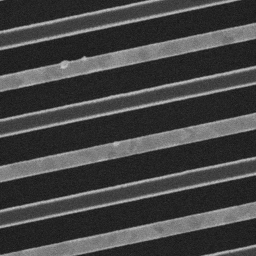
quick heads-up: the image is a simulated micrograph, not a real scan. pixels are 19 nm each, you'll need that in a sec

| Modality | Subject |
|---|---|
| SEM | lines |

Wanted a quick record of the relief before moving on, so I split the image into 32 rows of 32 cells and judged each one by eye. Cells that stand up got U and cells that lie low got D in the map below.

DDDDDDDDDDDDDDDDDUUUUUUUUUUUDDDD
DDDDDDDDDDDDUUUUUUUUUUUDDDDDDDDD
DDDDDDDUUUUUUUUUUUDDDDDDDDDDDDDD
DDUUUUUUUUUUUDDDDDDDDDDDDDDDDUUU
UUUUUUUUDDDDDDDDDDDDDDDDUUUUUUUU
UUUUDDDDDDDDDDDDDDDUUUUUUUUUUDDD
DDDDDDDDDDDDDDDUUUUUUUUUDDDDDDDD
DDDDDDDDDDUUUUUUUUUDDDDDDDDDDDDD
DDDDDUUUUUUUUUDDDDDDDDDDDDDDDDDU
UUUUUUUUUDDDDDDDDDDDDDDDDDUUUUUU
UUUUUDDDDDDDDDDDDDDDDUUUUUUUUUUU
DDDDDDDDDDDDDDDDDUUUUUUUUUUDDDDD
DDDDDDDDDDDDUUUUUUUUUUUDDDDDDDDD
DDDDDDDUUUUUUUUUUUDDDDDDDDDDDDDD
DDUUUUUUUUUUUDDDDDDDDDDDDDDDDDUU
UUUUUUUUDDDDDDDDDDDDDDDDDUUUUUUU
UUUDDDDDDDDDDDDDDDDDDUUUUUUUUUDD
DDDDDDDDDDDDDDDDUUUUUUUUUUDDDDDD
DDDDDDDDDDDUUUUUUUUUDDDDDDDDDDDD
DDDDDDUUUUUUUUUUDDDDDDDDDDDDDDDD
DUUUUUUUUUUDDDDDDDDDDDDDDDDDUUUU
UUUUUUDDDDDDDDDDDDDDDDDUUUUUUUUU
UDDDDDDDDDDDDDDDDDUUUUUUUUUUUDDD
DDDDDDDDDDDDDDUUUUUUUUUUDDDDDDDD
DDDDDDDDUUUUUUUUUUUDDDDDDDDDDDDD
DDDDUUUUUUUUUUDDDDDDDDDDDDDDDDDU
UUUUUUUUUUDDDDDDDDDDDDDDDDUUUUUU
UUUUUDDDDDDDDDDDDDDDDUUUUUUUUUUD
DDDDDDDDDDDDDDDDDUUUUUUUUUDDDDDD
DDDDDDDDDDDDUUUUUUUUUDDDDDDDDDDD
DDDDDDDUUUUUUUUUDDDDDDDDDDDDDDDD
DDUUUUUUUUUDDDDDDDDDDDDDDDDDUUUU